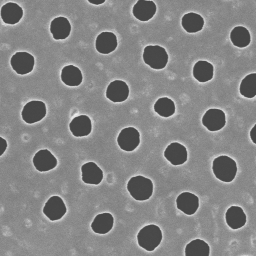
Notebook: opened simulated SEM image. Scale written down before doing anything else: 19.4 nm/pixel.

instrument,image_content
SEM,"a regular array of holes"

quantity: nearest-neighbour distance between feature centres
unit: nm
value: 948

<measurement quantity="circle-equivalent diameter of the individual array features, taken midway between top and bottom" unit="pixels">22.5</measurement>